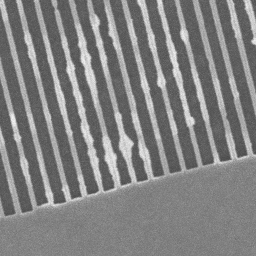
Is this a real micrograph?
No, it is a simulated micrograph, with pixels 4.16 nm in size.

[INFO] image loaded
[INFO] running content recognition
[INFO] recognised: parallel lines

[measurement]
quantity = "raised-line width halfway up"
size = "20.2 nm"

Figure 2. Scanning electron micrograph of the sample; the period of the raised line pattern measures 70.9 nm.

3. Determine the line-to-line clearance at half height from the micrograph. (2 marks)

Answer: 48.4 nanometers